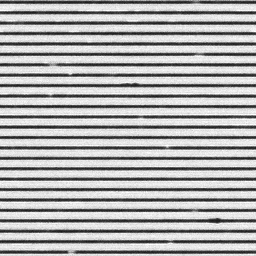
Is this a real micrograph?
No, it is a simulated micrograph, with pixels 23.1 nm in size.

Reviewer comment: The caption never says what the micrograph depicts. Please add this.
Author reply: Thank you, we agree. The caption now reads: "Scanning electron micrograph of parallel lines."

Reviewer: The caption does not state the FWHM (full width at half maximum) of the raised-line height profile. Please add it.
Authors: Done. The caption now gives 110 nm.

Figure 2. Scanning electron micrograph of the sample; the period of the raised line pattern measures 241 nm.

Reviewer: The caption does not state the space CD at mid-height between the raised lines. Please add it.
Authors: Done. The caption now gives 0.13 um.